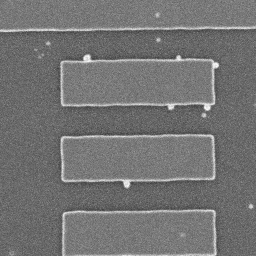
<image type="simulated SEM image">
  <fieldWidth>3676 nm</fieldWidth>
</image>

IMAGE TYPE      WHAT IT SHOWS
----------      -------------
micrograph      groups of lines, slits or small figures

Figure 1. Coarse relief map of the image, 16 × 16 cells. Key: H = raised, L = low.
HHHHHHHHHHHHHHHH
HHHHHHHHHHHHHHHH
LLLLLLLLLLLLLLLL
LLLLLLLLLLLLLLLL
LLLLHHHHHHHHHLLL
LLLLHHHHHHHHHLLL
LLLLHHHHHHHHHLLL
LLLLLLLLLLLLLLLL
LLLLLLLLLLHHHLLL
LLLLHHHHHHHHHLLL
LLLLHHHHHHHHHLLL
LLLLLLLLLLLLLLLL
LLLLLLLLLLLLLLLL
LLLLHHHHHHHHHLLL
LLLLHHHHHHHHHLLL
LLLLHHHHHHHHHHLL